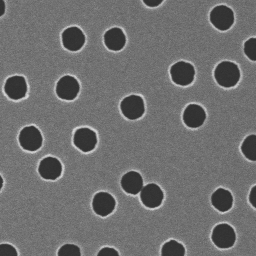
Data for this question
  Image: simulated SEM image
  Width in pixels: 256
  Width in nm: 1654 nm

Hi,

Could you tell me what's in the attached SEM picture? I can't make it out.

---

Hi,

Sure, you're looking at a regular array of holes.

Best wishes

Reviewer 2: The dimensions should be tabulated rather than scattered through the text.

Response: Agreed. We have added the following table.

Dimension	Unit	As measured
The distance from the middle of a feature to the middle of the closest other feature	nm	269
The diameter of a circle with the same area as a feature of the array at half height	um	0.15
